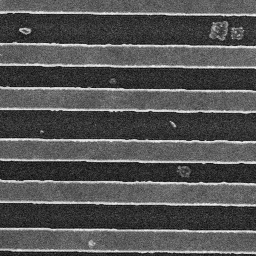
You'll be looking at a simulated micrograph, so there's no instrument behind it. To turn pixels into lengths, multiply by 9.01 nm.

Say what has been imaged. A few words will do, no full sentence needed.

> lines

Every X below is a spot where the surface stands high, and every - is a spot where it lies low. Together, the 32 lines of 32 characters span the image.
XXXXXXXXXXXXXXXXXXXXXXXXXXXXXXXX
XXXXXXXXXXXXXXXXXXXXXXXXXXXXXXXX
--------------------------------
--------------------------------
--------------------------------
XXXXXX--------------------------
XXXXXXXXXXXXXXXXXXXXXXXXXXXXXXXX
XXXXXXXXXXXXXXXXXXXXXXXXXXXXXXXX
--------------------------------
--------------------------------
--------------------------------
XXXXXXXXXXXXXXXXXXXXXXXXXXXXXXXX
XXXXXXXXXXXXXXXXXXXXXXXXXXXXXXXX
XXXXXXXXXXXXXXXXXXXXXXXXXXXXXXXX
--------------------------------
--------------------------------
--------------------------------
XXXXXXXXXXXXXXXXX---------------
XXXXXXXXXXXXXXXXXXXXXXXXXXXXXXXX
XXXXXXXXXXXXXXXXXXXXXXXXXXXXXXXX
--------------------------------
--------------------------------
--------------------------------
XXXXXXXXXXXXXXXXXXXXXXXXXXXXXXXX
XXXXXXXXXXXXXXXXXXXXXXXXXXXXXXXX
-------------XXXXXXXXXXXXXXXXXXX
--------------------------------
--------------------------------
--------------------------------
XXXXXXXXXXXXXXXXXXXXXXXXXXXXXXXX
XXXXXXXXXXXXXXXXXXXXXXXXXXXXXXXX
----------------------X-XXXXXXXX